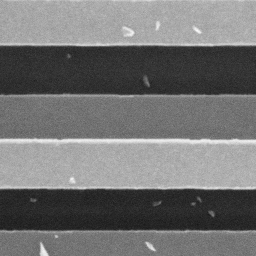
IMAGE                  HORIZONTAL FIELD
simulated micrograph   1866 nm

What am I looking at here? lines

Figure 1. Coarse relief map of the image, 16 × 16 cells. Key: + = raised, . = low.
++++++++++++++++
++++++++++++++++
++++++++++++++++
................
................
................
++++++++++++++++
++++++++++++++++
++++++++++++++++
++++++++++++++++
++++++++++++++++
++++++++++++++++
................
................
+++.++++++++++++
++++++++++++++++